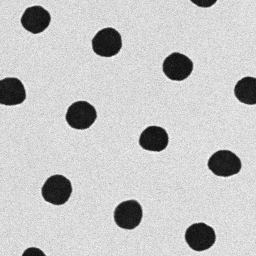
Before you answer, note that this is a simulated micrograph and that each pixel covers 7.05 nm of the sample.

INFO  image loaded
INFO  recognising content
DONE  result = a regular array of holes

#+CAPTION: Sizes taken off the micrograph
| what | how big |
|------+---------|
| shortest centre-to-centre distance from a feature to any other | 528 nm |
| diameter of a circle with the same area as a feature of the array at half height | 210 nm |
